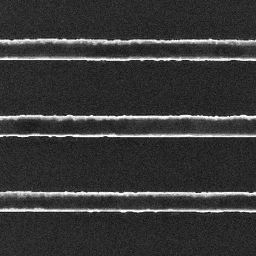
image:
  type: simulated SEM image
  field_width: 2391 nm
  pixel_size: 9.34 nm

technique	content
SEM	lines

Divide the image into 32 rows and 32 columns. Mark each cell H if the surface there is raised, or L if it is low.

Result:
LLLLLLLLLLLLLLLLLLLLLLLLLLLLLLLL
LLLLLLLLLLLLLLLLLLLLLLLLLLLLLLLL
LLLLLLLLLLLLLLLLLLLLLLLLLLLLLLLL
LLLLLLLLLLLLLLLLLLLLLLLLLLLLLLLL
LLLLLLLLLLLLLLLLLLLLLLLLLLLLLLLL
HHHHHHHHHHHHHHHHHHHHHHHHHHHHHHHH
HHHHHHHHHHHHHHHHHHHHHHHHHHHHHHHH
LLLLLLLLLLLLLLLLLLLHLLLLLLLLLLLH
LLLLLLLLLLLLLLLLLLLLLLLLLLLLLLLL
LLLLLLLLLLLLLLLLLLLLLLLLLLLLLLLL
LLLLLLLLLLLLLLLLLLLLLLLLLLLLLLLL
LLLLLLLLLLLLLLLLLLLLLLLLLLLLLLLL
LLLLLLLLLLLLLLLLLLLLLLLLLLLLLLLL
LLLLLLLLLLLLLLLLLLLLLLLLLLLLLLLL
LLLLLLLLLLLLLLLLLLLLLLLLLLLLLLLL
HHHHHHHHHHHHHHHHHHHHHHHHHHHHHHHH
HHHHHHHHHHHHHHHHHHHHHHHHHHHHHHHH
LLLLLLLLLLLLLLLLLLLLLLLLLLLLLLLL
LLLLLLLLLLLLLLLLLLLLLLLLLLLLLLLL
LLLLLLLLLLLLLLLLLLLLLLLLLLLLLLLL
LLLLLLLLLLLLLLLLLLLLLLLLLLLLLLLL
LLLLLLLLLLLLLLLLLLLLLLLLLLLLLLLL
LLLLLLLLLLLLLLLLLLLLLLLLLLLLLLLL
LLLLLLLLLLLLLLLLLLLLLLLLLLLLLLLL
HHHHHHHHHHHHHHHHHHHHHHHHHHHHHHHH
HHHHHHHHHHHHHHHHHHHHHHHHHHHHHHHH
LLLLLLLLLLLLLLLLLLLLLLLLLLLLLLLL
LLLLLLLLLLLLLLLLLLLLLLLLLLLLLLLL
LLLLLLLLLLLLLLLLLLLLLLLLLLLLLLLL
LLLLLLLLLLLLLLLLLLLLLLLLLLLLLLLL
LLLLLLLLLLLLLLLLLLLLLLLLLLLLLLLL
LLLLLLLLLLLLLLLLLLLLLLLLLLLLLLLL